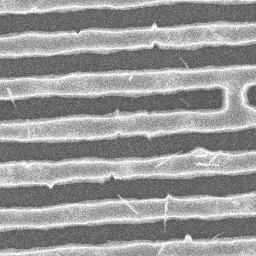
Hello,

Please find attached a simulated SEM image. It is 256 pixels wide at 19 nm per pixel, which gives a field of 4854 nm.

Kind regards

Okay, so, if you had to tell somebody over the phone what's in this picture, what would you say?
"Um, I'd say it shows parallel lines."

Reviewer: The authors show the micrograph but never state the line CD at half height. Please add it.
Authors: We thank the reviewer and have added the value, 395 nm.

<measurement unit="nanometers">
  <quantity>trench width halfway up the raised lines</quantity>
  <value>426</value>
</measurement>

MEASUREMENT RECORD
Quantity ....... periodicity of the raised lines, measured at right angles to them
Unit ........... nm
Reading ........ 815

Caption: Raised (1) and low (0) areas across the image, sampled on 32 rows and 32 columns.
11111111111111111110000000000000
11111100000000000000000000000000
00000000000000000000000000000000
00000000000000000001011111111111
01111111111111111111111111111111
11111111111111111111111111111100
11111111100000000000000000000000
00000000000000000000000000000000
00000000000000000000000000001111
00000000111111111111111111111111
11111111111111111111111111111111
11111111111111111111100000001110
00000000000000000000000000001110
00000000000000000000000000001111
00000000000000111111111111111111
11111111111111111111111111111111
11111111111111111111111001000000
11111111100000000000000000000000
00000000000000000000000000000000
00000000000000000000011111111111
01111111111111111111111111111111
11111111111111111111111111111100
11111111110110000000000000000000
00000000000000000000000000000000
00000000000000000000000000000111
00000000011111111111111111111111
11111111111111111111111111111111
11111111111111111110000000000000
11001100000000000000000000000000
00000000000000000000000000000000
00000000000000001111111111111111
11111111111111111111111111111111